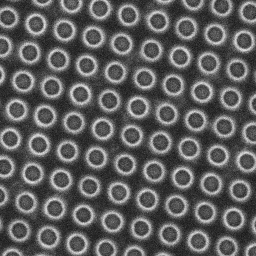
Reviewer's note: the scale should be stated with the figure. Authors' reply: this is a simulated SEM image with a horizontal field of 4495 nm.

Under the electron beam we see a regular array of holes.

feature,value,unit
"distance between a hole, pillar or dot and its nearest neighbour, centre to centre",511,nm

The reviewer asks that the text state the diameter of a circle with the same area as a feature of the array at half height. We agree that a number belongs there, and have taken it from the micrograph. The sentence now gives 297 nm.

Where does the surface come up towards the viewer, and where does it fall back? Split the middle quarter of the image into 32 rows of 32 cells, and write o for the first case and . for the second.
oooo....ooo...oooooooooooooooooo
oooo....ooo....ooooooooooooooooo
ooooooooooo....ooo....oooooooooo
ooooooooooo...oooo....oooo..oooo
oooooooooooooooooo....ooo....ooo
ooo..oooooooooooooo..oooo....ooo
oo....oooooooooooooooooooo...ooo
oo....oooo...ooooooooooooooooooo
oo....ooo....ooooooooooooooooooo
ooo..oooo.....ooo...oooooooooooo
oooooooooo...oooo....oooo.oooooo
ooooooooooooooooo....ooo...ooooo
ooooooooooooooooo...oooo....ooo.
o...oooooooooooooooooooo....ooo.
.....ooo...oooooooooooooo..oooo.
o...oooo....ooooooooooooooooooo.
oo..oooo....ooo...oooooooooooooo
oooooooo...oooo....ooooooooooooo
ooooooooooooooo....ooo....oooooo
oooooooooooooooo...ooo....oooo..
...ooooooooooooooooooo....ooo...
...oooo..oooooooooooooo..oooo...
...ooo....oooooooooooooooooooo..
..oooo....oooo...ooooooooooooooo
oooooo....ooo....ooooooooooooooo
ooooooooooooo....oooo...oooooooo
oooooooooooooo...ooo.....oooo.oo
.oooooooooooooooooooo....ooo....
.oooooooooooooooooooo...oooo....
.oooo...oooooooooooooooooooo....
.ooo....oooo...oooooooooooooo..o
ooooo...oooo....oooooooooooooooo